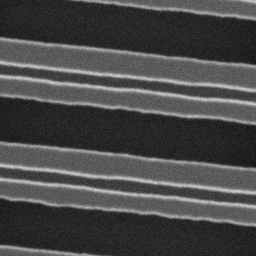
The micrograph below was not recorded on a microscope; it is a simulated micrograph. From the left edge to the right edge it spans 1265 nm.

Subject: lines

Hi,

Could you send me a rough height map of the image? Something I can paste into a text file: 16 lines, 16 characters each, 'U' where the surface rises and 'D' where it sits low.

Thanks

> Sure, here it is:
DDDDDDDDDUUUUUUU
DDDDDDDDDDDDDDDD
UDDDDDDDDDDDDDDD
UUUUUUUUUUDDDDDD
UUUUUUUUUUUUUUUU
UUUUUUUUUUUUUUUU
DDDDDUUUUUUUUUUU
DDDDDDDDDDDDDDUU
DDDDDDDDDDDDDDDD
UUUUUUDDDDDDDDDD
UUUUUUUUUUUUUUUD
UUUUUUUUUUUUUUUU
DUUUUUUUUUUUUUUU
DDDDDDDDDDUUUUUU
DDDDDDDDDDDDDDDD
UDDDDDDDDDDDDDDD